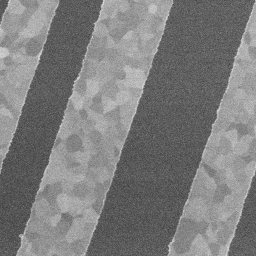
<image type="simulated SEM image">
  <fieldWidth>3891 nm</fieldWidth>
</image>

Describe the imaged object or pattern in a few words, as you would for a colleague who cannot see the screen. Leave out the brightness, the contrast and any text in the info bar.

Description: one or a few lines or trenches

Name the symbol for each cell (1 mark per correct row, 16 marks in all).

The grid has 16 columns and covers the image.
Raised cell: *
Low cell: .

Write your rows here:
****..*****.....
***...****.....*
***...****.....*
***..*****.....*
**...****.....**
**...****.....**
*...*****.....**
*...****.....***
*...****.....***
...*****.....***
...****.....****
...****.....****
..*****.....***.
..****.....****.
.*****.....****.
.****......***..